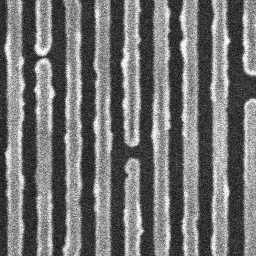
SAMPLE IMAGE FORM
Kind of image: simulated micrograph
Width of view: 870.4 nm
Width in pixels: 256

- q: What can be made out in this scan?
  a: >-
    parallel lines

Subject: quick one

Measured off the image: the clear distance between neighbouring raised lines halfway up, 0.051 um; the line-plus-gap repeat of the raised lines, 99.5 nm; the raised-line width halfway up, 50.6 nm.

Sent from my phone